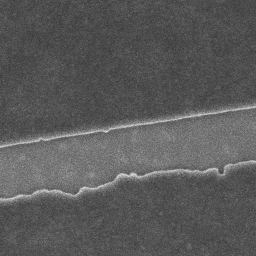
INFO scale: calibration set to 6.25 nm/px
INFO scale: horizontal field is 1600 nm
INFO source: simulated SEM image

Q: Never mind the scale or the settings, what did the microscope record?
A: one or a few lines or trenches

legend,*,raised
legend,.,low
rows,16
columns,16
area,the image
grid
****************
****************
****************
****************
****************
****************
****************
***********.....
****............
................
..............**
.......*********
****************
****************
****************
****************